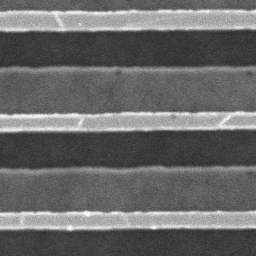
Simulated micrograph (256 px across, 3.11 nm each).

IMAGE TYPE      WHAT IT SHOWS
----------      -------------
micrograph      lines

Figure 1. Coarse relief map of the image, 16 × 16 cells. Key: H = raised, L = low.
HHHHHHHHHHHHHHHH
HHHHHHHHHHHHHHHH
LLLLLLLLLLLLLLLL
LLLLLLLLLLLLLLLL
HHHHHHHHHHHHHHHH
HHHHHHHHHHHHHHHH
HHHHHHHHHHHHHHHH
HHHHHHHHHHHHHHHH
LLLLLLLLLLLLLLLL
LLLLLLLLLLLLLLLL
LLLLLLLLLHLHLHHH
HHHHHHHHHHHHHHHH
HHHHHHHHHHHHHHHH
HHHHHHHHHHHHHHHH
LLLLLLLLLLLLLLLL
LLLLLLLLLLLLLLLL